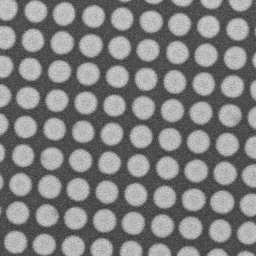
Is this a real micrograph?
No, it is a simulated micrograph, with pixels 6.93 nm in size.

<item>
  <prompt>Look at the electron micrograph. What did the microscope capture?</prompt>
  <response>an array of small figures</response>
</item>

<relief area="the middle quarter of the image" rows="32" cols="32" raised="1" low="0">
10001111000001000000000000000000
11011111100111100001110000000000
11011111100111110011111000111100
10011111100111110011111001111100
00001111000111110011111001111100
00000000000011100011111001111100
00000000000000000000100000111100
10001110000000000000000000000000
10011111000111000011100000000000
10011111001111100111110001111000
10011111001111100111111001111100
00011111001111100111111011111101
00000000000111000011110011111101
00000000000000000001100001111000
00001100000000000000000000000000
00111110001111000011000000000000
00111110011111100111100001110000
00111110011111100111110011111000
00111110011111000111110011111001
00001100001111000111110011111001
00000000000000000011100011111001
00011000000000000000000001100000
00111100001110000000000000000000
01111110011111000111000001100000
01111110011111001111100011110001
00111110011111001111100111111001
00011100011110001111100111111011
00000000000000000111000011110011
00000000000000000000000001100001
01111100011100000000000000000000
01111100111110001111000000000000
01111100111110011111000111100001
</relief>